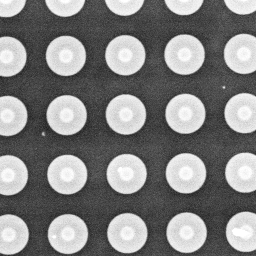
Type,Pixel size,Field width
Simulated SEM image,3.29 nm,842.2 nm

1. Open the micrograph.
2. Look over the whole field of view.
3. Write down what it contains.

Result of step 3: an array of small figures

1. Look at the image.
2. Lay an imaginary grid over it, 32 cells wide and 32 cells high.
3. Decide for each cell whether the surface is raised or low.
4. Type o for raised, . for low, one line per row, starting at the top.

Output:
ooo...oooo...ooooo...oooo...oooo
oo.....ooo....ooo.....oo.....ooo
................................
................................
...............o......oo.....ooo
ooo...oooo....oooo...oooo...oooo
ooo...ooooo..ooooo...ooooo..oooo
ooo...ooooo..ooooo...oooo...oooo
ooo...oooo....oooo...oooo....ooo
o...............................
................................
................................
oo.....ooo....ooo....oooo....ooo
ooo...ooooo..ooooo...ooooo..oooo
ooo...ooooo..ooooo...ooooo..oooo
ooo...ooooo...oooo...oooo....ooo
oo.....ooo.....oo.....oo......o.
................................
................................
oo......o......oo.....oo.....ooo
ooo...oooo....oooo...oooo...oooo
ooo...ooooo..ooooo...ooooo..oooo
ooo...ooooo..ooooo...ooooo..oooo
ooo....ooo....oooo....ooo....ooo
................................
................................
................................
ooo....ooo....oooo...oooo....ooo
ooo...ooooo...oooo...ooooo..oooo
oooo..ooooo..ooooo...ooooo..oooo
ooo...ooooo...oooo...oooo....ooo
oo.....oo......oo......o........